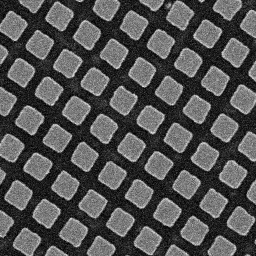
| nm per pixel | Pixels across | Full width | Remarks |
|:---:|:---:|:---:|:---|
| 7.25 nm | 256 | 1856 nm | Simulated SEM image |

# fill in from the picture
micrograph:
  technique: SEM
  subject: a regular array of raised bodies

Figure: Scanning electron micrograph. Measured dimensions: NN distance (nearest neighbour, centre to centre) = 0.239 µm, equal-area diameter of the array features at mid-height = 182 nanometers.